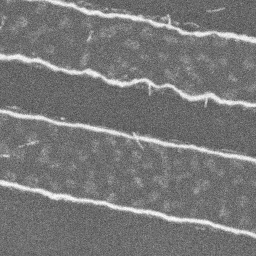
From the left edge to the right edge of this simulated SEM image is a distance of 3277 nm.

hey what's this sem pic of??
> one or a few lines or trenches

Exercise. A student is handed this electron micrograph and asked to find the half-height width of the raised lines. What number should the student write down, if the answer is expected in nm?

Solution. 901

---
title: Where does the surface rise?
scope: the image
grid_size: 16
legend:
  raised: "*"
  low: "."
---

*****...........
**********......
****************
****************
....************
...........*****
...............*
***.............
********........
*************...
****************
****************
.....***********
..........******
...............*
................